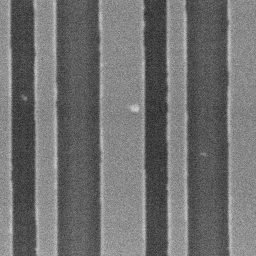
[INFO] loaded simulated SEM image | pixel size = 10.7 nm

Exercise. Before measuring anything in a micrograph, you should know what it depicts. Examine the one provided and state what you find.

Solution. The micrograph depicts lines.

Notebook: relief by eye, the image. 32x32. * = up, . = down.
*...***......*****...**......***
*...***......*****...**......***
*...***......*****...**......***
*...***......*****...**......***
*...***......*****...**......***
*...***......*****...**......***
*....**......*****...**......***
*...***......*****...**......***
*...***......*****...**......***
*...***......*****...**......***
*...***......*****...**......***
*...***......*****...**......***
*....**......*****...**......***
*...***......*****...**......***
*...***......*****...**......***
*....**......*****...**......***
*....**......*****...**......***
*....**......*****...**......***
*....**......*****...**......***
*....**......*****...**......***
*....**......*****...**......***
*....**......*****...**......***
*....**......*****...**......***
*....**......*****...**......***
*....**......*****...**......***
*....**......*****...**......***
*....**......*****...**......***
*....**......*****...**......***
*....**......*****...**......***
*....**......*****...**......***
*....**......*****...**......***
*....**......*****...**......***